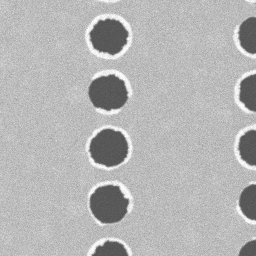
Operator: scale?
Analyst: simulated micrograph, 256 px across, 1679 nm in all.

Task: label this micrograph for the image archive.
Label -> holes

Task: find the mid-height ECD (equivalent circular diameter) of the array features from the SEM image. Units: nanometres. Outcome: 251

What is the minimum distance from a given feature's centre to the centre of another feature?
366 nm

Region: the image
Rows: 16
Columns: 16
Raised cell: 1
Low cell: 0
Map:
1111111111111111
1111110011111110
1111110011111110
1111111111111111
1111111111111111
1111110011111110
1111110011111110
1111111111111111
1111110011111110
1111110011111110
1111111111111111
1111111111111111
1111110011111110
1111110011111110
1111111111111111
1111110011111110